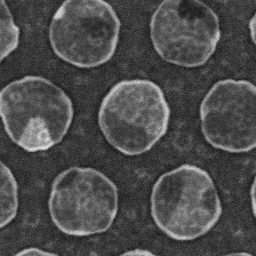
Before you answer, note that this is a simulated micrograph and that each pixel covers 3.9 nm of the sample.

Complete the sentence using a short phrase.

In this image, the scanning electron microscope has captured raised bodies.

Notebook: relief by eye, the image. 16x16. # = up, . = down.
....###...###...
#..####...####..
#..####...####..
....###...###...
................
####...###...###
####..####...###
####..####...###
.###...###...###
........#.......
................
#...###...###...
#..####...####..
#..####...####..
....##.....##...
................